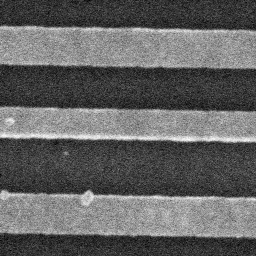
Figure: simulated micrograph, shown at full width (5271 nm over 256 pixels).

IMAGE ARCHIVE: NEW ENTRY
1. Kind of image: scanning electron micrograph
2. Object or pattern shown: lines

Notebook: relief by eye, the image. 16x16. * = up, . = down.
................
................
****************
****************
................
................
................
****************
****************
................
................
................
****************
****************
****************
................